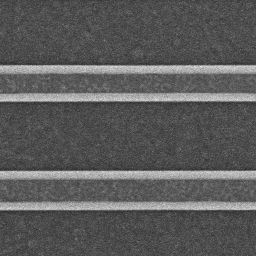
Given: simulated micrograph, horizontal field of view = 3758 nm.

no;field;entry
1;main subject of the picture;one or a few lines or trenches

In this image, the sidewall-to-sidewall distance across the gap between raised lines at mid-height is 1120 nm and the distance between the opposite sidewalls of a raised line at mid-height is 459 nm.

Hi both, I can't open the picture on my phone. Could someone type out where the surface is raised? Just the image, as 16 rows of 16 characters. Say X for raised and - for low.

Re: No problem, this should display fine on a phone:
----------------
----------------
----------------
----------------
XXXXXXXXXXXXXXXX
XXXXXXXXXXXXXXXX
----------------
----------------
----------------
----------------
----------------
XXXXXXXXXXXXXXXX
XXXXXXXXXXXXXXXX
----------------
----------------
----------------